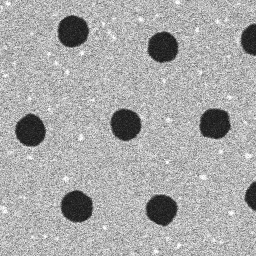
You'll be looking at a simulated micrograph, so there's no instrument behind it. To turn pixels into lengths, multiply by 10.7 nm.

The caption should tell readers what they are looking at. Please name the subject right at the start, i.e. holes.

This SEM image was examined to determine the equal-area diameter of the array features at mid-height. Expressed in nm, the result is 335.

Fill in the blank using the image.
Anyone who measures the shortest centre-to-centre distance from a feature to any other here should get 920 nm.